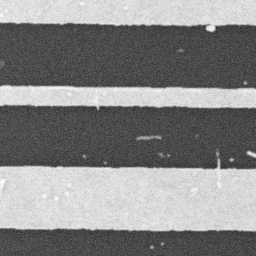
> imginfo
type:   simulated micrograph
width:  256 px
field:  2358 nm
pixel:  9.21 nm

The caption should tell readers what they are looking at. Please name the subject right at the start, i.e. lines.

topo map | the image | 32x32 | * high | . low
********************************
********************************
********************************
..........................*.....
................................
................................
................................
................................
................................
................................
................................
**************************....**
********************************
................................
................................
................................
................................
................................
................................
................................
................................
********************************
********************************
********************************
********************************
********************************
********************************
********************************
..******************************
................................
................................
................................